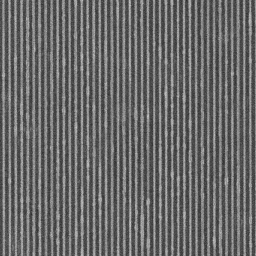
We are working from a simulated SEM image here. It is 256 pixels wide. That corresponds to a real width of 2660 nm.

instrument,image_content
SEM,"parallel lines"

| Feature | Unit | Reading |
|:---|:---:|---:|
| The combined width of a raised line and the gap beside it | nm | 62.5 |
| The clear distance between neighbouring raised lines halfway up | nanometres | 42.9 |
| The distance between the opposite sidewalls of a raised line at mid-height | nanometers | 19.5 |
